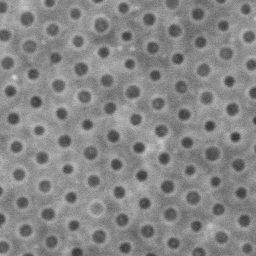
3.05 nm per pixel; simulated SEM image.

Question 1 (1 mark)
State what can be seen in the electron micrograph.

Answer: a regular array of holes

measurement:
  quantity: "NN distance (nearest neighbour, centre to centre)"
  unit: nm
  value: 84.7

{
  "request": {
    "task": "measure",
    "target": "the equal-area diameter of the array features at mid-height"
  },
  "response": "40 nanometres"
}